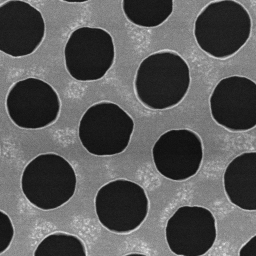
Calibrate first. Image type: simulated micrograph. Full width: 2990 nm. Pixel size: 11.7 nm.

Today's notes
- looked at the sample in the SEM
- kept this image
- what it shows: holes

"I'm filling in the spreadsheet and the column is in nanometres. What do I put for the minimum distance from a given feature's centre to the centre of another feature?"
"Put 881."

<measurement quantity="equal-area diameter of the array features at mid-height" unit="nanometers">618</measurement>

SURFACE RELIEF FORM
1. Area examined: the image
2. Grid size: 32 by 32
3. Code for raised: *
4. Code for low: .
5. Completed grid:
....***********.......****....**
.....***********.....****......*
.....***********.....****......*
......****..************.......*
.....****.....**********.......*
.....***......***********.....**
....****......************...***
********......****.....*********
********......***.......********
*********....****.......********
**....***********.......***.....
*......**********......****.....
*......***********.....***......
*......****....****..*****......
*......***......***********.....
**....****.......**********.....
**********......*****...********
**********......****.....*******
***********.....***......*******
*****..************......*****..
****.....**********......****...
***......***********.....***....
***.......*****.******.*****....
***......****.....**********....
***......***......**********....
****....****......***********...
************......****....******
.***********......***......*****
..***********....****......*****
..****...************......*****
.****.....***********......****.
****.......***********....****..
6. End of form